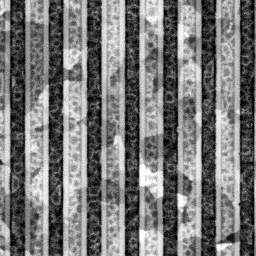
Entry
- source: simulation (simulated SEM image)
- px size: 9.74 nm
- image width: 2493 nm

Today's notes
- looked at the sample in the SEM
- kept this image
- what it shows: parallel lines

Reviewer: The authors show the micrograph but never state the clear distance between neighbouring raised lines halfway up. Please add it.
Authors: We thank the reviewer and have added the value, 0.191 um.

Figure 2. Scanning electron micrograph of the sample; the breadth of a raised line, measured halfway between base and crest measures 0.183 micrometres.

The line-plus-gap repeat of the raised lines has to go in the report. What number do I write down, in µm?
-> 0.372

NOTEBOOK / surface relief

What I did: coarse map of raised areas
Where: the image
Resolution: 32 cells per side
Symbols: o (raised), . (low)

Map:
o...oo..ooo..oo...oo...oo..ooo..
o...oo..ooo..oo...oo...oo..ooo..
o...oo..ooo..oo...oo...oo..ooo..
o...oo..ooo..oo...oo...oo..ooo..
o...oo..ooo..oo...oo...oo..ooo..
o...oo..ooo..oo...oo...oo..ooo..
o...oo..ooo..oo...oo...oo..ooo..
o...oo..ooo..oo...oo...oo..ooo..
o...oo..ooo..oo...oo...oo..ooo..
o...oo..ooo..oo...oo...oo..ooo..
o...oo..ooo..oo...oo...oo..ooo..
o...oo..ooo..oo...oo...oo..ooo..
o..ooo..ooo..oo...oo...oo..ooo..
o..ooo..ooo..oo...oo...oo..ooo..
o..ooo..ooo..oo...oo...oo..ooo..
o..ooo..ooo..oo...oo..ooo..ooo..
o..ooo..ooo..oo...oo..ooo..ooo..
o..ooo..ooo..oo...oo...oo..ooo..
o..ooo..ooo..oo...oo...oo..ooo..
o..ooo..ooo..oo...oo...oo..ooo..
o..ooo..ooo..oo...oo...oo..ooo..
o..ooo..ooo..oo...oo...oo..ooo..
o..ooo..ooo..oo...oo...oo..ooo..
o..ooo..ooo..oo...oo...oo..ooo..
o..ooo..ooo..oo...oo...oo..ooo..
o..ooo..ooo..oo...oo...oo..ooo..
o..ooo..ooo..oo...oo...oo..ooo..
o..ooo..ooo..oo...oo...oo..ooo..
o..ooo..ooo..oo...oo...oo..ooo..
o..ooo..ooo..oo...oo...oo..ooo..
o..ooo..ooo..oo...oo...oo..ooo..
o..ooo..ooo..oo...oo...oo..ooo..